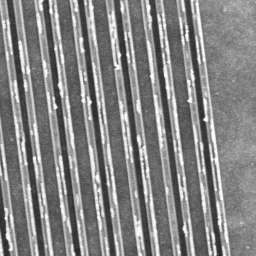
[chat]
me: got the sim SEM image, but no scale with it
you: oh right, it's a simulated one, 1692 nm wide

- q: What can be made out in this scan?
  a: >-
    parallel lines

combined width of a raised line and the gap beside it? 17.4 px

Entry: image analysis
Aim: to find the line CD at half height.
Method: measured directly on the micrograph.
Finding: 47.5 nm